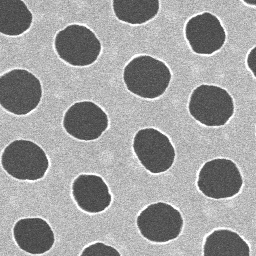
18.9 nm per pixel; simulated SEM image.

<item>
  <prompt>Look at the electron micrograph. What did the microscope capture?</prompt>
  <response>a regular array of holes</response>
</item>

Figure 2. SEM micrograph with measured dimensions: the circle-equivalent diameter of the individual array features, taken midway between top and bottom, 806 nm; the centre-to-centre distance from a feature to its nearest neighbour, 1360 nanometres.